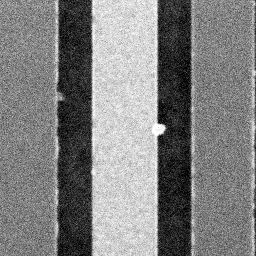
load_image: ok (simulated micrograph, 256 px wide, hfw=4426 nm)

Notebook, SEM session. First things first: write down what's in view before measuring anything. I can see lines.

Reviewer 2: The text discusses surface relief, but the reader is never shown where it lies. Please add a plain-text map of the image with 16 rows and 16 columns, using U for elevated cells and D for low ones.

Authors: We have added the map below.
UUUUDDUUUUDDUUUU
UUUUDDUUUUDDUUUU
UUUUDDUUUUDDUUUU
UUUUDDUUUUDDUUUU
UUUUDDUUUUDDUUUU
UUUUDDUUUUDDUUUU
UUUUDDUUUUDDUUUU
UUUUDDUUUUDDUUUU
UUUUDDUUUUDDUUUU
UUUUDDUUUUDDUUUU
UUUUDDUUUUDDUUUU
UUUUDDUUUUDDUUUU
UUUUDDUUUUDDUUUU
UUUUDDUUUUDDUUUU
UUUUDDUUUUDDUUUU
UUUUDDUUUUDDUUUU